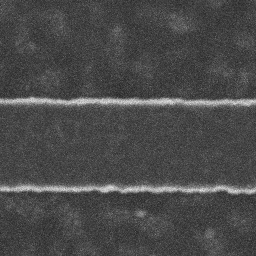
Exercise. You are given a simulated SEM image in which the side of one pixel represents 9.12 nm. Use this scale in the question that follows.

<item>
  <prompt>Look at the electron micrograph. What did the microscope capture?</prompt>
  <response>one or a few lines or trenches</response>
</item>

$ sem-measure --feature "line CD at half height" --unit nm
815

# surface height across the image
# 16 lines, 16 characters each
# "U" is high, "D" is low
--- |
DDDDDDDDDDDDDDDD
DDDDDDDDDDDDDDDD
DDDDDDDDDDDDDDDD
DDDDDDDDDDDDDDDD
DDDDDDDDDDDDDDDD
DDDDDDDDDDDDDDDD
UUUUUUUUUUUUUUUU
UUUUUUUUUUUUUUUU
UUUUUUUUUUUUUUUU
UUUUUUUUUUUUUUUU
UUUUUUUUUUUUUUUU
UUUUUUUUUUUUUUUU
DDDDDDDDDDDDDDDD
DDDDDDDDDDDDDDDD
DDDDDDDDDDDDDDDD
DDDDDDDDDDDDDDDD